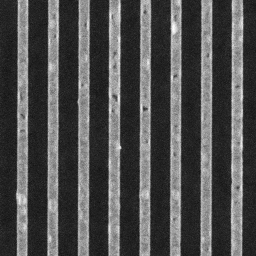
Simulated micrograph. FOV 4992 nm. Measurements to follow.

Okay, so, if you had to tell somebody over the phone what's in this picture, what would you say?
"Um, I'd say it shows parallel lines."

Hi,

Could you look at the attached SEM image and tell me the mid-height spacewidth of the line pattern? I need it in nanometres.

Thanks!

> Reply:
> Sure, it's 400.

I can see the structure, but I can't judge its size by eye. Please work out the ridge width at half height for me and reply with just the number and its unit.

193 nm